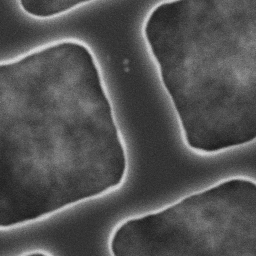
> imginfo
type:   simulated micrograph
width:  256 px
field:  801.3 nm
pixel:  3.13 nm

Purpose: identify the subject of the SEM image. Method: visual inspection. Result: holes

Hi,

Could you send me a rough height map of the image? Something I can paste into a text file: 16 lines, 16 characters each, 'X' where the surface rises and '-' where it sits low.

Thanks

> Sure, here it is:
XX---XXXXX------
XXXXXXXXX-------
XXXXXXXXX-------
XX----XXXX------
------XXXX------
-------XXX------
-------XXXX-----
-------XXXX-----
-------XXXXX----
--------XXXXXXXX
--------XXXXXXXX
-------XXXXXXX--
-----XXXXXX-----
---XXXXXX-------
XXXXXXX---------
XXXXXXX---------